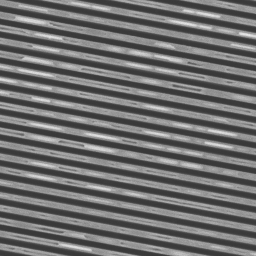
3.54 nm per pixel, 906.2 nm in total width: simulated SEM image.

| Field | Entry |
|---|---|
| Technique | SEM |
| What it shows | parallel lines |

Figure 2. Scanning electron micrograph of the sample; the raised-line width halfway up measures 24 nm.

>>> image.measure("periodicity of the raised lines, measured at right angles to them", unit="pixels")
12.7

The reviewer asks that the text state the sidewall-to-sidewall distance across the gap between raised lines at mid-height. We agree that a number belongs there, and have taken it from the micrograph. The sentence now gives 0.0209 microns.